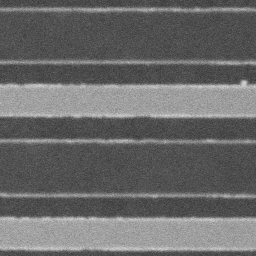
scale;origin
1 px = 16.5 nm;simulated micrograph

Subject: lines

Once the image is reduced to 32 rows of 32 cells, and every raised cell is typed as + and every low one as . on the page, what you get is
................................
++++++++++++++++++++++++++++++++
++++++++++++++++++++++++++++++++
++++++++++++++++++++++++++++++++
++++++++++++++++++++++++++++++++
++++++++++++++++++++++++++++++++
++++++++++++++++++++++++++++++++
++++++++++++++++++++++++++++++++
................................
................................
................................
++++++++++++++++++++++++++++++++
++++++++++++++++++++++++++++++++
++++++++++++++++++++++++++++++++
.........+....++....++++++++++++
................................
................................
................................
++++++++++++++++++++++++++++++++
++++++++++++++++++++++++++++++++
++++++++++++++++++++++++++++++++
++++++++++++++++++++++++++++++++
++++++++++++++++++++++++++++++++
++++++++++++++++++++++++++++++++
...................+......++++++
................................
................................
++++++++++++++++++++++++++++++++
++++++++++++++++++++++++++++++++
++++++++++++++++++++++++++++++++
++++++++++++++++++++++++++++++++
................................